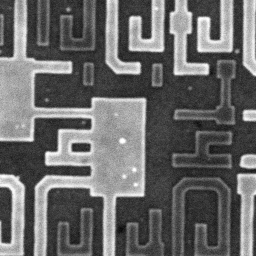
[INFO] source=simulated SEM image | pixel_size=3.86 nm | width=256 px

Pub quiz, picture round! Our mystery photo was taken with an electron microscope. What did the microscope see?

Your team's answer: wiring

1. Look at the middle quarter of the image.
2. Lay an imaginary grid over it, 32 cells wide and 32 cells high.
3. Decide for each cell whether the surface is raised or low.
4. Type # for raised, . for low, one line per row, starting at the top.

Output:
##...##....########...##....####
##...##.....#######...##....####
.....##...............##....####
.....##...............##........
.....##...............##........
................................
................................
................................
................................
.......#############............
.......#############............
####################............
####################........####
......##############........####
.......#############............
.......#############............
......##############............
####################............
####################............
####################............
##.....#############............
##.....#############............
####################............
####################.......#####
####################.......#####
.......#############........####
.......#############............
.......#############............
####################..........##
####################.........###
####################........####
.......#############.......####.